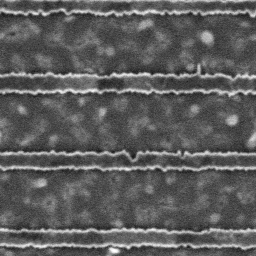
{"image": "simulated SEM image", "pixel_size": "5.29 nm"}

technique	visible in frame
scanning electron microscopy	one or a few lines or trenches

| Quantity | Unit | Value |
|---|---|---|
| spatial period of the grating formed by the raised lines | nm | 405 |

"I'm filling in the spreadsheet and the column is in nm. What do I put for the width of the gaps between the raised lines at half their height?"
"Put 321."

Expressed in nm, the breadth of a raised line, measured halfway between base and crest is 85.3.